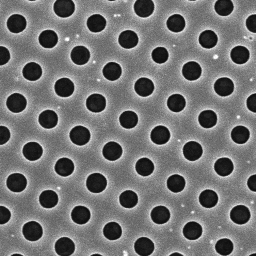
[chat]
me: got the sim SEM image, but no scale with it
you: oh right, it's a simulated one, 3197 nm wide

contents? a regular array of holes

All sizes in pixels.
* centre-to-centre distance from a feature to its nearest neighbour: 35.4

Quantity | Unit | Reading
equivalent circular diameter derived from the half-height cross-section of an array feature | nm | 244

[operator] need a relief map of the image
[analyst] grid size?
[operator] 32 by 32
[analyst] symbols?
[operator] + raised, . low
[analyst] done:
+++++++..++++++++..++++++++..+++
+++++++..++++++++..++++++++..+++
+..++++++++..++++++++..++++++++.
+..++++++++..++++++++..++++++++.
+++++..++++++++..++++++++..+++++
+++++..++++++++..++++++++..+++++
.++++++++..++++++++..++++++++..+
.++++++++..++++++++..++++++++..+
+++..++++++++..++++++++..+++++++
+++..++++++++..++++++++..+++++++
+++++++..++++++++..++++++++..+++
+++++++..++++++++..++++++++..+++
+..++++++++..++++++++..++++++++.
+..++++++++..++++++++..++++++++.
+++++..++++++++..++++++++..+++++
+++++..++++++++..++++++++..+++++
.++++++++..++++++++..++++++++..+
.++++++++..++++++++..++++++++..+
+++..++++++++..++++++++..+++++++
+++..++++++++..++++++++..+++++++
+++++++..++++++++..++++++++..+++
+++++++..++++++++..++++++++..+++
+..++++++++..++++++++..++++++++.
+..++++++++..++++++++..++++++++.
+++++..++++++++..++++++++..+++++
+++++..++++++++..++++++++..+++++
.++++++++..++++++++..++++++++..+
.++++++++..++++++++..++++++++..+
+++..++++++++..++++++++..+++++++
+++..++++++++..++++++++..+++++++
+++++++..++++++++..++++++++..+++
+++++++..++++++++..++++++++..+++